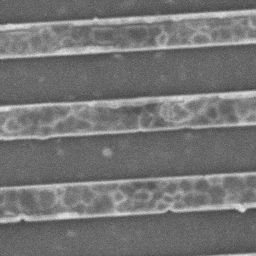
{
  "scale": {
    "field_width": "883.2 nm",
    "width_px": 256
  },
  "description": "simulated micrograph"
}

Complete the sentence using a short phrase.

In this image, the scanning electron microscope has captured one or a few lines or trenches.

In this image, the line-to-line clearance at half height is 169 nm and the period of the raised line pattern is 0.281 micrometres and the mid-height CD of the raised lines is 110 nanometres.